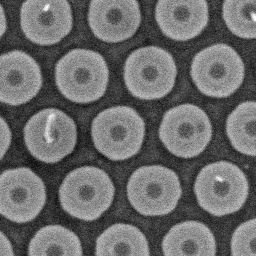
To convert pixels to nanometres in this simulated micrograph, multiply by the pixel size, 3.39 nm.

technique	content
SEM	an array of small figures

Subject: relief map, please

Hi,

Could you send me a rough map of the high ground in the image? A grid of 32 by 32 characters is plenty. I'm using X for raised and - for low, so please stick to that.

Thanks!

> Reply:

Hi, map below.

---XXXXXX--XXXXXX---XXXXXX--XXXX
---XXXXXX--XXXXXX--XXXXXXX--XXXX
X--XXXXXX--XXXXXXX--XXXXXX--XXXX
X--XXXXXX--XXXXXX---XXXXX----XXX
---XXXXX----XXXX-----XXX------XX
-----XX-------------------------
-XX------XXX-----XXXX----XXXX---
XXXX----XXXXX---XXXXXX--XXXXXX--
XXXXX--XXXXXX---XXXXXX--XXXXXX--
XXXXX--XXXXXX---XXXXXX--XXXXXX--
XXXXX--XXXXXX---XXXXXX--XXXXXX--
XXXXX---XXXXX---XXXXX----XXXX---
XXXX-----XXX--------------------
--------------XX------XXX-----XX
----XXXX----XXXXX----XXXXX---XXX
X--XXXXXX--XXXXXXX--XXXXXX--XXXX
X--XXXXXXX-XXXXXXX--XXXXXX--XXXX
X--XXXXXXX--XXXXXX--XXXXXX---XXX
X--XXXXXX---XXXXXX---XXXXX---XXX
----XXXX-----XXX------XX--------
--------------------------XXX---
-XXX-----XXXX----XXXXX---XXXXX--
XXXXX---XXXXXX--XXXXXX--XXXXXXX-
XXXXXX-XXXXXXX--XXXXXXX-XXXXXXX-
XXXXXX-XXXXXXX--XXXXXXX--XXXXXX-
XXXXXX--XXXXXX--XXXXXX---XXXXX--
XXXXX---XXXXX----XXXX-----XXX---
-XXX-------X-------------------X
-----XXX------XXX----XXXXX----XX
X---XXXXXX--XXXXXX---XXXXXX--XXX
X---XXXXXX--XXXXXX--XXXXXXX--XXX
XX--XXXXXX--XXXXXXX-XXXXXXX--XXX